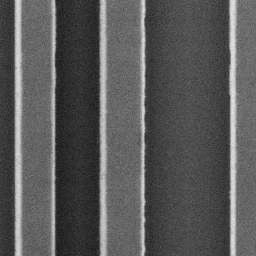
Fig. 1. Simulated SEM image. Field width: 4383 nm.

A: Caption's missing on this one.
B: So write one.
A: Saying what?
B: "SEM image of lines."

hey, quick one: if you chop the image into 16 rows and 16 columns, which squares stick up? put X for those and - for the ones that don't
-XX---XXX------X
-XX---XXX------X
-XX---XXX------X
-XX---XXX------X
-XX---XXX------X
-XX---XXX------X
-XX---XXX------X
-XX---XXX------X
-XX---XXX------X
-XX---XXX------X
-XX---XXX------X
-XX---XXX------X
-XX---XXX------X
-XX---XXX------X
-XX---XXX------X
-XX---XXX------X